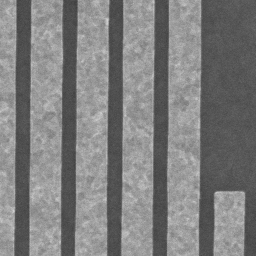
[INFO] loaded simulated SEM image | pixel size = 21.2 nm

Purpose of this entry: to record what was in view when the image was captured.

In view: wiring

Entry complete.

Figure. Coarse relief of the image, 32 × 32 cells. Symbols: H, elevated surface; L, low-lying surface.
HHLLHHHHLLHHHHLHHHHLLHHHHLLLLLLL
HHLLHHHHLLHHHLLHHHHLLHHHHLLLLLLL
HHLLHHHHLLHHHLLHHHHLLHHHHLLLLLLL
HHLLHHHHLLHHHLLHHHHLLHHHHLLLLLLL
HHLLHHHHLLHHHLLHHHHLLHHHHLLLLLLL
HHLLHHHHLLHHHLLHHHHLLHHHHLLLLLLL
HHLLHHHHLLHHHLLHHHHLLHHHHLLLLLLL
HHLLHHHHLLHHHLLHHHHLLHHHHLLLLLLL
HHLLHHHHLLHHHLLHHHHLLHHHHLLLLLLL
HHLLHHHHLLHHHLLHHHHLLHHHHLLLLLLL
HHLLHHHHLLHHHLLHHHHLLHHHHLLLLLLL
HHLLHHHHLLHHHLLHHHHLLHHHHLLLLLLL
HHLLHHHHLLHHHLLHHHHLLHHHHLLLLLLL
HHLLHHHHLLHHHLLHHHHLLHHHHLLLLLLL
HHLLHHHHLLHHHLLHHHHLLHHHHLLLLLLL
HHLLHHHHLLHHHLLHHHHLLHHHHLLLLLLL
HHLLHHHHLLHHHLLHHHHLLHHHHLLLLLLL
HHLLHHHHLLHHHLLHHHHLLHHHHLLLLLLL
HHLLHHHHLLHHHLLHHHHLLHHHHLLLLLLL
HHLLHHHHLLHHHLLHHHHLLHHHHLLLLLLL
HHLLHHHHLLHHHLLHHHHLLHHHHLLLLLLL
HHLLHHHHLLHHHLLHHHHLLHHHHLLLLLLL
HHLLHHHHLLHHHLLHHHHLLHHHHLLLLLLL
HHLLHHHHLLHHHLLHHHHLLHHHHLLLLLLL
HHLLHHHLLLHHHLLHHHHLLHHHHLLHHHLL
HHLLHHHHLLHHHLLHHHHLLHHHHLLHHHLL
HHLLHHHHLLHHHLLHHHHLLHHHHLLHHHLL
HHLLHHHHLLHHHLLHHHHLLHHHHLLHHHLL
HHLLHHHHLHHHHLLHHHHLLHHHHLLHHHLL
HHLLHHHHLHHHHLLHHHHLLHHHHLLHHHLL
HHLLHHHLLHHHHLLHHHHLLHHHHLLHHHLL
HHLLHHHLLHHHHLLHHHHLLHHHHLLHHHLL